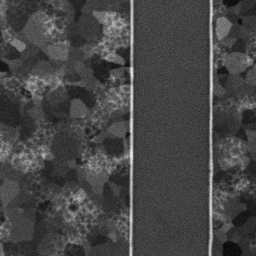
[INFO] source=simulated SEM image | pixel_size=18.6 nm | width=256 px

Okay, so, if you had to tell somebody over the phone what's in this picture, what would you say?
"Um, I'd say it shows one or a few lines or trenches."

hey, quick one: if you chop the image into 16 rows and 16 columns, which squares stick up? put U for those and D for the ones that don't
UUUUUUUUDDDDDUUU
UUUUUUUUDDDDDUUU
UUUUUUUUDDDDDUUU
UUUUUUUUDDDDDUUU
UUUUUUUUDDDDDUUU
UUUUUUUUDDDDDUUU
UUUUUUUUDDDDDUUU
UUUUUUUUDDDDDUUU
UUUUUUUUDDDDDUUU
UUUUUUUUDDDDDUUU
UUUUUUUUDDDDDUUU
UUUUUUUUDDDDDUUU
UUUUUUUUDDDDDUUU
UUUUUUUUDDDDDUUU
UUUUUUUUDDDDDUUU
UUUUUUUUDDDDDUUU